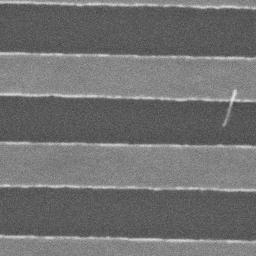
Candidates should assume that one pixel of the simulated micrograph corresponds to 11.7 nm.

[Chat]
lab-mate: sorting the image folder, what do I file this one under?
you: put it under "lines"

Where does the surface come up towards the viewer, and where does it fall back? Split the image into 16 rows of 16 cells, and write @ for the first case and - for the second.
---------------@
----------------
----------------
@@@@@@@@@-------
@@@@@@@@@@@@@@@@
@@@@@@@@@@@@@@@@
----------------
----------------
----------------
@@@@@@@@@@@@@@@@
@@@@@@@@@@@@@@@@
@@@@@@@@@@@@@@@@
----------------
----------------
----------------
@@@@@@@@@@@@@@@@